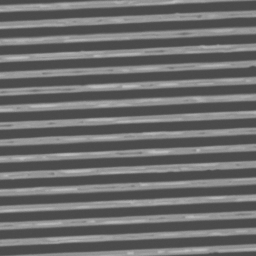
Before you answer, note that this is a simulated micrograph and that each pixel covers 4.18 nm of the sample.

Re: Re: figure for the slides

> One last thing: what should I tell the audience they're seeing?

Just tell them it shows parallel lines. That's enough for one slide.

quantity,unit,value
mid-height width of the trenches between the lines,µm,0.0402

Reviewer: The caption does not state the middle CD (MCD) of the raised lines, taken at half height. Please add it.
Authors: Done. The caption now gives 0.0318 um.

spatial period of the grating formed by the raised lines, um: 0.0698